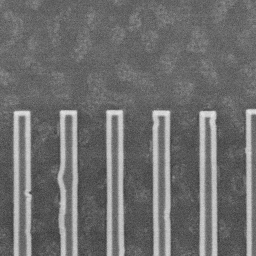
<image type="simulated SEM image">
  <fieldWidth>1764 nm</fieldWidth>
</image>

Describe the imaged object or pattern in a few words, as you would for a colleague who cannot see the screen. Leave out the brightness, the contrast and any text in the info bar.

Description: parallel lines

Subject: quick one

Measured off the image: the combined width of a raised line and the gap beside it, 46.4 pixels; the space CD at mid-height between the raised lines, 235 nm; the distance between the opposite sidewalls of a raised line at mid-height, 0.0844 micrometres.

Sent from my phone